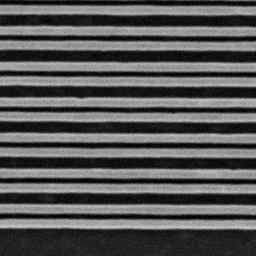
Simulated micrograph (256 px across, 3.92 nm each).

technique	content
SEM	parallel lines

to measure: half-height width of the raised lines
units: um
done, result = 0.0309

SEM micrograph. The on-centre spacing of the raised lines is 69.8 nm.